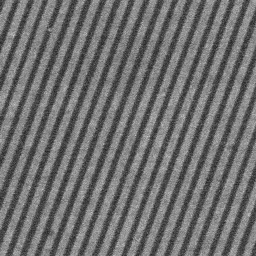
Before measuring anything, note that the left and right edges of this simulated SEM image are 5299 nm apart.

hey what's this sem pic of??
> parallel lines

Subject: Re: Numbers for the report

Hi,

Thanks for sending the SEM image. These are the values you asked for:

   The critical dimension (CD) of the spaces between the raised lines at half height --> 143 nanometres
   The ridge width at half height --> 136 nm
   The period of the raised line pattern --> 279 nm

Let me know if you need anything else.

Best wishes